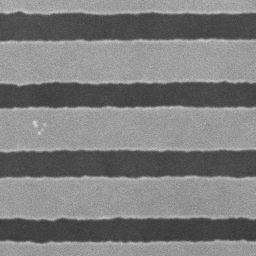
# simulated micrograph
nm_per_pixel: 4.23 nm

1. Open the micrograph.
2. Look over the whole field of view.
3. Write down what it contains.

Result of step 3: lines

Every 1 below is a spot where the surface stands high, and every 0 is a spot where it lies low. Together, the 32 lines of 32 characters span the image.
11111111111111111111111111111111
11011111111111111111111111111111
00000000000000000000000000000000
00000000000000000000000000000000
00000000000000000000000000000000
11111111111111111111111111111111
11111111111111111111111111111111
11111111111111111111111111111111
11111111111111111111111111111111
11111111111111111111111111111111
00110000000000000000000000000000
00000000000000000000000000000000
00000000000000000000000000000000
00011100111111111111111111101111
11111111111111111111111111111111
11111111111111111111111111111111
11111111111111111111111111111111
11111111111111111111111111111111
11111111111111111111111111111111
00000000000000000000000000000000
00000000000000000000000000000000
00000000000000000000000000000000
11111111111111111111111111111111
11111111111111111111111111111111
11111111111111111111111111111111
11111111111111111111111111111111
11111111111111111111111111111111
00000010000000000000000000000000
00000000000000000000000000000000
00000000000000000000000000000000
11111111111111111111111111111111
11111111111111111111111111111111